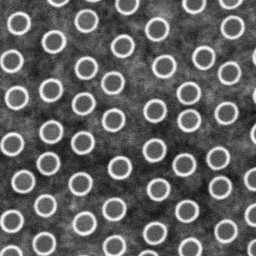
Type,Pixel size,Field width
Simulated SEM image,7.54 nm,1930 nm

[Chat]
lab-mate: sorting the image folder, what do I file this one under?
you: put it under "a regular array of raised bodies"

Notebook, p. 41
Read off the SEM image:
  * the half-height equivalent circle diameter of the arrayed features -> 0.16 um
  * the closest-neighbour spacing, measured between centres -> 264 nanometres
